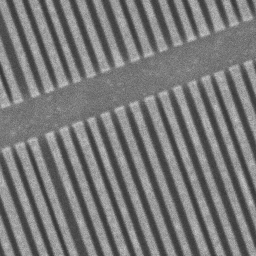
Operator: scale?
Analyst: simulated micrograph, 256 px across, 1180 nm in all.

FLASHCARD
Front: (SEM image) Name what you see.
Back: parallel lines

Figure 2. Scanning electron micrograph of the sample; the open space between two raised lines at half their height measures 32 nm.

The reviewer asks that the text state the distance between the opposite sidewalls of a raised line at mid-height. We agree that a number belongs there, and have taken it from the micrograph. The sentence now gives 40.1 nm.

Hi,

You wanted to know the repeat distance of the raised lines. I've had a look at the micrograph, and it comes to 69.7 nm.